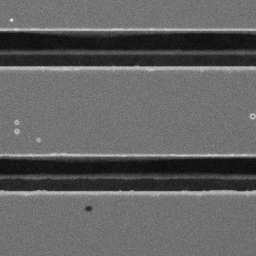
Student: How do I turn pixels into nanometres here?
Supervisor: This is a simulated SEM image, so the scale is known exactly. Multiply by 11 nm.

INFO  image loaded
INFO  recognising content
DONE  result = lines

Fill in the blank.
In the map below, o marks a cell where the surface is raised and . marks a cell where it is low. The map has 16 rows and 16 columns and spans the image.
oooooooooooooooo
oooooooooooooooo
................
................
oooooooooooooooo
oooooooooooooooo
oooooooooooooooo
oooooooooooooooo
oooooooooooooooo
oooooooooooooooo
................
................
oooooooooooooooo
oooooooooooooooo
oooooooooooooooo
oooooooooooooooo